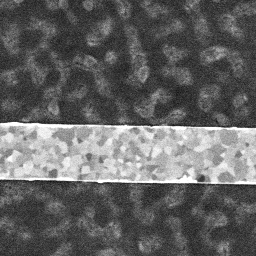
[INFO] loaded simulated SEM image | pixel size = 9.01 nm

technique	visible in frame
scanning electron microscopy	one or a few lines or trenches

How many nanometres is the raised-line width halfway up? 501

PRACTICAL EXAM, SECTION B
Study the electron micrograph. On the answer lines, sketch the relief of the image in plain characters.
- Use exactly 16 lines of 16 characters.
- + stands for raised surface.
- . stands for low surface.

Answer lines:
................
................
................
................
................
................
................
................
++++++++++++++++
++++++++++++++++
++++++++++++++++
................
................
................
................
................